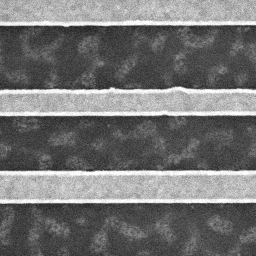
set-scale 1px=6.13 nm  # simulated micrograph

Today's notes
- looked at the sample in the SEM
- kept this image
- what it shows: one or a few lines or trenches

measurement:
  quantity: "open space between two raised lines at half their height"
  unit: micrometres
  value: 0.379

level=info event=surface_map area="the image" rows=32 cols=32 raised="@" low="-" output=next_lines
@@@@@@@@@@@@@@@@@@@@@@@@@@@@@@@@
@@@@@@@@@@@@@@@@@@@@@@@@@@@@@@@@
@@@@@@@@@@@@@@@@@@@@@@@@@@@@@@@@
--------------------------------
--------------------------------
--------------------------------
--------------------------------
--------------------------------
--------------------------------
--------------------------------
--------------------------------
@@@@@@@@@@@@@@@@@@@@@@@@@@@@@@@@
@@@@@@@@@@@@@@@@@@@@@@@@@@@@@@@@
@@@@@@@@@@@@@@@@@@@@@@@@@@@@@@@@
--------------------------------
--------------------------------
--------------------------------
--------------------------------
--------------------------------
--------------------------------
--------------------------------
------------------@----@@@------
@@@@@@@@@@@@@@@@@@@@@@@@@@@@@@@@
@@@@@@@@@@@@@@@@@@@@@@@@@@@@@@@@
@@@@@@@@@@@@@@@@@@@@@@@@@@@@@@@@
--------------------------------
--------------------------------
--------------------------------
--------------------------------
--------------------------------
--------------------------------
--------------------------------